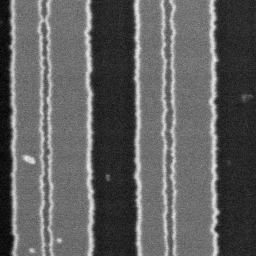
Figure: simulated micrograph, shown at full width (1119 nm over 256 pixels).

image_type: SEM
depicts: lines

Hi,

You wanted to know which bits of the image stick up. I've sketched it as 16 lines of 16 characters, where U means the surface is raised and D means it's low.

DUUUUUDDDUUUUDDD
DUUUUUDDDUUUUDDD
DUUUUDDDDUUUUDDD
DUUUUUDDDUUUUDDD
DUUUUUDDDUUUUDDD
DUUUUUDDDUUUUDDD
DUUUUUDDDUUUUDDD
DUUUUUDDDUUUUDDD
DUUUUUDDDUUUUDDD
DUUUUUDDDUUUUDDD
DUUUUUDDDUUUUDDD
DUUUUUDDDUUUUDDD
DUUUUUDDDUUUUDDD
DUUUUUDDDUUUUDDD
DUUUUUDDDUUUUDDD
DUUUUUDDDUUUUDDD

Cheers